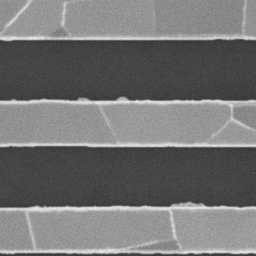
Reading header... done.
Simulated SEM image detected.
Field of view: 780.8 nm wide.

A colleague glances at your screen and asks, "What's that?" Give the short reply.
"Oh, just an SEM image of lines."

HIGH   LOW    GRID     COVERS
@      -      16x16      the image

@@@@@@@@@@@@@@@@
@@@@@@@@@@@@@@@@
@---------------
----------------
----------------
----------------
@@@@@@@@@@@@@@@@
@@@@@@@@@@@@@@@@
@@@@@@@@@@@@@@@@
----------------
----------------
----------------
----------------
@@@@@@@@@@@@@@@@
@@@@@@@@@@@@@@@@
@@@@@@@@@@@@@@@@